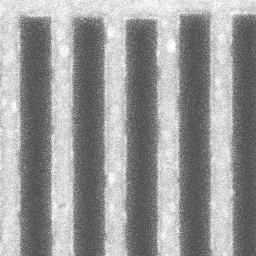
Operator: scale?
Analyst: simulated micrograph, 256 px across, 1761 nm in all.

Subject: parallel lines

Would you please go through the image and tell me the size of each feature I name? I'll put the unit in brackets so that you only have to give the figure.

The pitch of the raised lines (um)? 0.364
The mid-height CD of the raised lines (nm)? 244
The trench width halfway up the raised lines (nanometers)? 120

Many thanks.